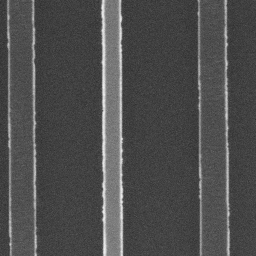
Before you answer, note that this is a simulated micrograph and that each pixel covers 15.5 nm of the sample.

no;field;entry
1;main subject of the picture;lines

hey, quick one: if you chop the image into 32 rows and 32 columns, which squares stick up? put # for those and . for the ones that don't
.###.........##..........###....
.###.........##..........###....
.###.........##..........###....
.###.........##..........###....
.###.........##..........###....
.###.........##..........###....
.###.........##..........###....
.###.........##..........###....
.###.........##..........###....
.###.........##..........###....
.###.........##..........###....
.###.........##..........###....
.###.........##..........###....
.###.........##..........###....
.###.........##..........###....
.###.........##..........###....
.###.........##..........###....
.###.........##..........###....
.###.........##..........###....
.###.........##..........###....
.###.........##..........###....
.###.........##..........###....
.###.........##..........###....
.###.........##..........###....
.###.........##..........###....
.###.........##..........###....
.###.........##..........###....
.###.........##..........###....
.###.........##..........####...
.###.........##..........####...
.####........##..........####...
.###.........##..........####...